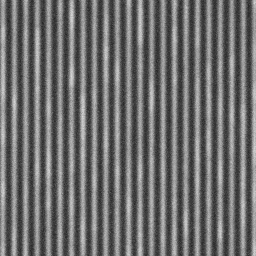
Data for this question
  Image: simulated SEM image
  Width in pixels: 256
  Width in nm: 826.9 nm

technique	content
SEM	parallel lines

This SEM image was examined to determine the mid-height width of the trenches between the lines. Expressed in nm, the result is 26.2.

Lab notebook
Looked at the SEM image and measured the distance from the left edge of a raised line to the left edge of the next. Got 11.4 pixels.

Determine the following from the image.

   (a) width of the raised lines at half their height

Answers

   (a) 2.76 pixels